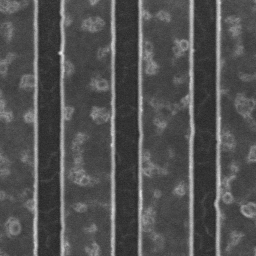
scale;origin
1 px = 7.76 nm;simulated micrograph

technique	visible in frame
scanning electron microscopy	one or a few lines or trenches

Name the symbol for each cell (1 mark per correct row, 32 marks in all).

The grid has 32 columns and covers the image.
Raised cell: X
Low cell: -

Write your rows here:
XXXXX---XXXXXX----XXXXXX---XXXXX
XXXXX---XXXXXX----XXXXXX---XXXXX
XXXX----XXXXXX----XXXXXX---XXXXX
XXXXX---XXXXXX----XXXXXX---XXXXX
XXXXX---XXXXXX----XXXXXX---XXXXX
XXXXX---XXXXXX----XXXXXX---XXXXX
XXXXX---XXXXXX----XXXXXX---XXXXX
XXXXX---XXXXXX----XXXXXX---XXXXX
XXXX----XXXXXX----XXXXXX---XXXXX
XXXXX---XXXXXX----XXXXXX---XXXXX
XXXXX---XXXXXX----XXXXXX---XXXXX
XXXXX---XXXXXX----XXXXXX---XXXXX
XXXX----XXXXXX----XXXXXX---XXXXX
XXXX----XXXXXX----XXXXXX---XXXXX
XXXX----XXXXXX----XXXXXX---XXXXX
XXXX----XXXXXX----XXXXXX---XXXXX
XXXXX---XXXXXX----XXXXXX---XXXXX
XXXXX---XXXXXX----XXXXXX---XXXXX
XXXXX---XXXXXX----XXXXXX---XXXXX
XXXXX---XXXXXX----XXXXXX---XXXXX
XXXXX---XXXXXX----XXXXXX---XXXXX
XXXXX---XXXXXX----XXXXXX---XXXXX
XXXXX---XXXXXX----XXXXXX---XXXXX
XXXX----XXXXXX----XXXXXX---XXXXX
XXXX----XXXXXX----XXXXXX---XXXXX
XXXXX---XXXXXX----XXXXXX---XXXXX
XXXXX---XXXXXX----XXXXXX---XXXXX
XXXXX---XXXXXX----XXXXXX---XXXXX
XXXX----XXXXXX----XXXXXX---XXXXX
XXXX----XXXXXX----XXXXXX---XXXXX
XXXXX---XXXXXX----XXXXXX---XXXXX
XXXX----XXXXXX----XXXXXX---XXXXX